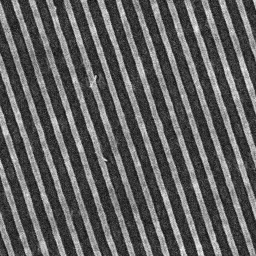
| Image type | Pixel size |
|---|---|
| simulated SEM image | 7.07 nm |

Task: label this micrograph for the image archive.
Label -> parallel lines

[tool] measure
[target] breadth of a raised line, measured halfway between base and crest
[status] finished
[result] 38.6 nanometers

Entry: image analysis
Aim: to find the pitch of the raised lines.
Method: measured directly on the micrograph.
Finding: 116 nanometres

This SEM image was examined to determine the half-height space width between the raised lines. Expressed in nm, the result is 77.2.